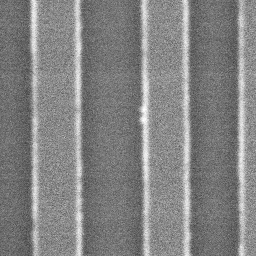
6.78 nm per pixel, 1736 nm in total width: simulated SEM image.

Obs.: lines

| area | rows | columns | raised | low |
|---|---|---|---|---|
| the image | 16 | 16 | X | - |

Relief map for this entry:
--XXX----XXX---X
--XXX----XXX---X
--XXX----XXX---X
--XXX----XXX---X
--XXX----XXX---X
--XXX----XXX---X
--XXX----XXX---X
--XXX----XXX---X
--XXX----XXX---X
--XXX----XXX---X
--XXX----XXX---X
--XXX----XXX---X
--XXX----XXX---X
--XXX----XXX---X
--XXX----XXX---X
--XXX----XXX---X